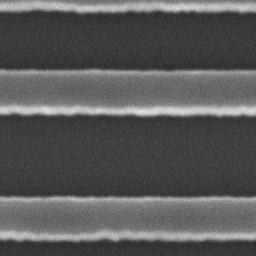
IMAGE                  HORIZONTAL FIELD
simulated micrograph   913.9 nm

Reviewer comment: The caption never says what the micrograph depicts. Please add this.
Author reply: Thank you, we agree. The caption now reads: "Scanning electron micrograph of lines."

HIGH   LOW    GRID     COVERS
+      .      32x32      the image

++++++++++++++++++++++++++++++++
................................
................................
................................
................................
................................
................................
................................
................................
++++++++++++++++++++++++++++++++
++++++++++++++++++++++++++++++++
++++++++++++++++++++++++++++++++
++++++++++++++++++++++++++++++++
++++++++++++++++++++++++++++++++
................................
................................
................................
................................
................................
................................
................................
................................
................................
................................
................................
++++++++++++++++++++++++++++++++
++++++++++++++++++++++++++++++++
++++++++++++++++++++++++++++++++
++++++++++++++++++++++++++++++++
++++++++++++++++++++++++++++++++
................................
................................